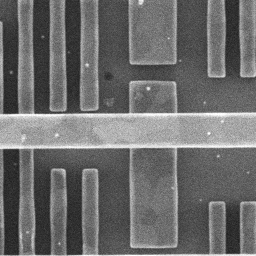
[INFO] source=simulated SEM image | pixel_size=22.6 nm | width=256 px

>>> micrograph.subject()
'wiring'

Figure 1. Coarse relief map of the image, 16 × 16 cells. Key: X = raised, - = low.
----------------
----------------
----------------
----------------
----------------
----------------
----------------
XXXXXXXXXXXXXXXX
XXXXXXXXXXXXXXXX
----------------
----------------
----------------
----------------
----------------
----------------
----------------